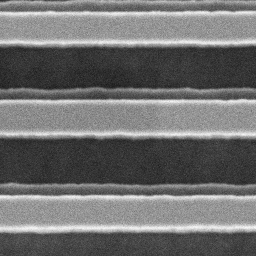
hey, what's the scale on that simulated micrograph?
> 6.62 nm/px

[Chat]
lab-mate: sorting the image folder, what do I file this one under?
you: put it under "lines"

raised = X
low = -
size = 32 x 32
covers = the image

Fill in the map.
--------------------------------
-----XX---X--------XX--XXXXXXXXX
XXXXXXXXXXXXXXXXXXXXXXXXXXXXXXXX
XXXXXXXXXXXXXXXXXXXXXXXXXXXXXXXX
XXXXXXXXXXXXXXXXXXXXXXXXXXXXXXXX
--------------------------------
--------------------------------
--------------------------------
--------------------------------
--------------------------------
--------------------------------
--------------------------------
-------------XXX------X-------X-
XXXXXXXXXXXXXXXXXXXXXXXXXXXXXXXX
XXXXXXXXXXXXXXXXXXXXXXXXXXXXXXXX
XXXXXXXXXXXXXXXXXXXXXXXXXXXXXXXX
XXXXXXXXXXXXXXXXXXXXXXXXXXXXXXXX
--------------------------------
--------------------------------
--------------------------------
--------------------------------
--------------------------------
--------------------------------
--------------------------------
--------------------------------
XXXXXXXXXXXXXXXXXXXXXXXXXXXXXXXX
XXXXXXXXXXXXXXXXXXXXXXXXXXXXXXXX
XXXXXXXXXXXXXXXXXXXXXXXXXXXXXXXX
XXXXXXXXXXXXXXXXXXXXXXX----XX-XX
--------------------------------
--------------------------------
--------------------------------